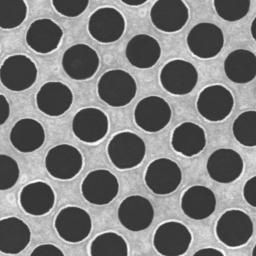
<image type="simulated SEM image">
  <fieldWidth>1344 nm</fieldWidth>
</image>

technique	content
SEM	a regular array of holes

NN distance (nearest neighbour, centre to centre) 232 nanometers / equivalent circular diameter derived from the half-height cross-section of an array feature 188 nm